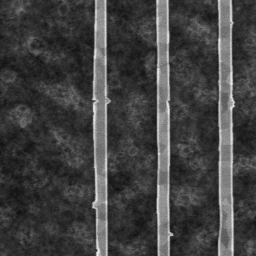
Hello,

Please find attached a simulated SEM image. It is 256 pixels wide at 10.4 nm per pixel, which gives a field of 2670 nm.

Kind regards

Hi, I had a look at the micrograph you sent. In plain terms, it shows one or a few lines or trenches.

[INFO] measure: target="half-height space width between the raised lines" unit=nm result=541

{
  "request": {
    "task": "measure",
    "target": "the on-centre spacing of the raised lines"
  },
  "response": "652 nm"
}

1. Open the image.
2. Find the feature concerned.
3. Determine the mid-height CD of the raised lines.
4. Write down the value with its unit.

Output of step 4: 117 nanometers